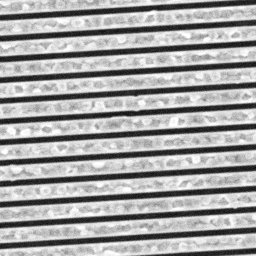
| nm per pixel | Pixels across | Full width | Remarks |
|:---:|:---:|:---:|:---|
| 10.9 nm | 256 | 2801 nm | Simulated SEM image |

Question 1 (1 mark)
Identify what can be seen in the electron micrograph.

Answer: parallel lines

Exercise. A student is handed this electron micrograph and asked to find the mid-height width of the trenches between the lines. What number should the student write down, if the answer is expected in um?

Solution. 0.0751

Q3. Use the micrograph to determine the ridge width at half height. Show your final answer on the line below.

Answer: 149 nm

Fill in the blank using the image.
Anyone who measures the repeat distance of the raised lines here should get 227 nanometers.